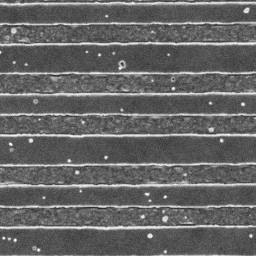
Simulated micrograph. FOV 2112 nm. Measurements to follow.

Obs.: lines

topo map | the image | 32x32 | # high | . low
#...############################
################################
################################
................................
................................
....############################
################################
################################
################################
................................
................................
................................
################################
################################
................................
................................
................................
################################
################################
################################
#########################...##..
................................
................................
################################
################################
################################
................................
................................
############..##################
################################
################################
################################